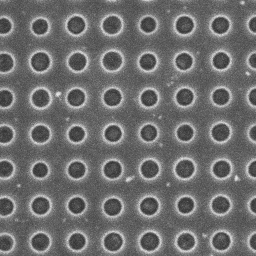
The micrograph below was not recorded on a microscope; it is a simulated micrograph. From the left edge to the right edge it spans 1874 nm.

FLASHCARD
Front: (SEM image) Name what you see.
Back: a regular array of holes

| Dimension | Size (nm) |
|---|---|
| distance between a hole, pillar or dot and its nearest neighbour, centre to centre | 260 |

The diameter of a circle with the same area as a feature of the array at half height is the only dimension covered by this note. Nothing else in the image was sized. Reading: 138 nm